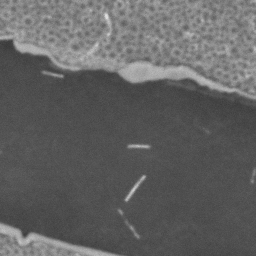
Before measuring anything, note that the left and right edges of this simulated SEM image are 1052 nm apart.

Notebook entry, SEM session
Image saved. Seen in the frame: one or a few lines or trenches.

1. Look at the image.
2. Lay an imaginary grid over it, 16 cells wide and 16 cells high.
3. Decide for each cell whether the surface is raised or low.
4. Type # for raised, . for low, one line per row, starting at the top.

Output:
################
################
.###############
...#############
........########
.............###
................
................
................
................
................
................
................
................
#...............
#####...........